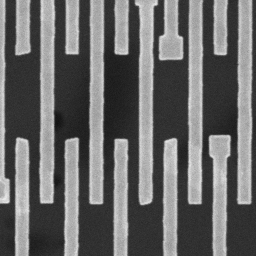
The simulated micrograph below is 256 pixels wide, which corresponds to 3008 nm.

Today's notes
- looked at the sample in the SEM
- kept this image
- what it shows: wiring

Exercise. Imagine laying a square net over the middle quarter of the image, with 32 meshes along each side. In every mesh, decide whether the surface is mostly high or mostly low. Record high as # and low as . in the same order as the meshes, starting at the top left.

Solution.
.......###.........###..........
.......###.........###..........
.......###.........###..........
.......###.........###..........
.......###.........###..........
.......###.........###..........
.......###.........###..........
.......###.........###..........
.......###.........###..........
.......###.........###.........#
.......###.........###..........
.......##..........###.........#
.......##..........###.........#
.......###.........###.........#
.......##..........###..........
.......##..........###..........
.......##..........###..........
.......##..........###..........
.......##..........###..........
.##....##....###...###....##....
.##....##....###...###...###...#
.##....##....###...###...###...#
.##....##....###...###...###...#
.##....##....###...###...###...#
.##....##....###...###...###....
.##....##....###...###...###...#
.##....###...###...###...###...#
.##....###...###...###...###...#
.##....##....###...###...###...#
.##....##....###...###...###...#
.##....##....###...###...###...#
.##....##....###...###...###...#